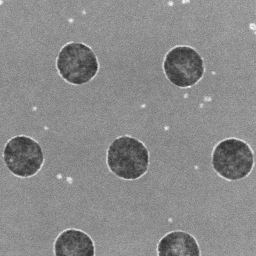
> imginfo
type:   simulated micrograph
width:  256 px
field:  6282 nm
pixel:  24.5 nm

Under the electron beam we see holes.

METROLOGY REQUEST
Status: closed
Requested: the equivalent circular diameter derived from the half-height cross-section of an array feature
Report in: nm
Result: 1000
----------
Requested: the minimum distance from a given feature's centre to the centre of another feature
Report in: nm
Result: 2570